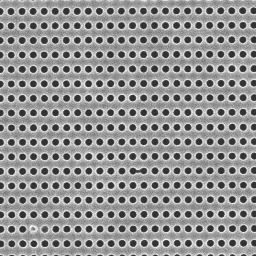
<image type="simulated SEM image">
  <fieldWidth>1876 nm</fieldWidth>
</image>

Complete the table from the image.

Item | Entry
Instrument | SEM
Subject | a regular array of holes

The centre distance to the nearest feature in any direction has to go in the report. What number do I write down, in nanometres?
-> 79.3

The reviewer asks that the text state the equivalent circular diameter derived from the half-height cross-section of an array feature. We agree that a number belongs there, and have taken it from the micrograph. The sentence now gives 48.2 nm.